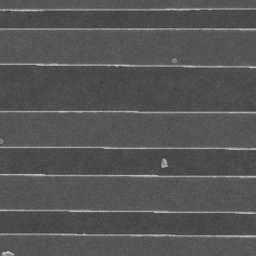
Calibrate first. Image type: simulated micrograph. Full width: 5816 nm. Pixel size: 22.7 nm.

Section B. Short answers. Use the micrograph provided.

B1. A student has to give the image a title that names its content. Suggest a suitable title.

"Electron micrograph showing lines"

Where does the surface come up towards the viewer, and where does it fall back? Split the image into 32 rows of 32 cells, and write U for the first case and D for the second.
UUUUUUUUUUUUUUUUUUUUUUUUUUUUUUUU
DDDDDDDDDDDDDDDDDDDDDDDDDDDDDDDD
DDDDDDDDDDDDDDDDDDDDDDDDDDDDDDDD
DDDDDDDDDDDDDDDDDDDDDDDDDDDDDDDD
UUUUUUUUUUUUUUUUUUUUUUUUUUUUUUUU
UUUUUUUUUUUUUUUUUUUUUUUUUUUUUUUU
UUUUUUUUUUUUUUUUUUUUUUUUUUUUUUUU
UUUUUUUUUUUUUUUUUUUUUUUUUUUUUUUU
DDDDDDDDDDDDDDDDDDDDDDDDDDDDDDDD
DDDDDDDDDDDDDDDDDDDDDDDDDDDDDDDD
DDDDDDDDDDDDDDDDDDDDDDDDDDDDDDDD
DDDDDDDDDDDDDDDDDDDDDDDDDDDDDDDD
DDDDDDDDDDDDDDDDDDDDDDDDDDDDDDDD
DDDDDDDDDDDDDDDDDDDDDDDDDDDDDDDD
UUUUUUUUUUUUUUUUUUUUUUUUUUUUUUUU
UUUUUUUUUUUUUUUUUUUUUUUUUUUUUUUU
UUUUUUUUUUUUUUUUUUUUUUUUUUUUUUUU
UUUUUUUUUUUUUUUUUUUUUUUUUUUUUUUU
DDDDDDDDDDDDDUUUUUUUUUUUUUUUUUUU
DDDDDDDDDDDDDDDDDDDDDDDDDDDDDDDD
DDDDDDDDDDDDDDDDDDDDDDDDDDDDDDDD
DDDDDDDDDDDDDDDDDDDDDDDDDDDDDDDD
UUUUUUUUUUUUUUUUUUUUUUUUUUUUUUUU
UUUUUUUUUUUUUUUUUUUUUUUUUUUUUUUU
UUUUUUUUUUUUUUUUUUUUUUUUUUUUUUUU
UUUUUUUUUUUUUUUUUUUUUUUUUUUUUUUU
DDDDDDDDDDDDDDDDDDDUUUUUUUUUUUUU
DDDDDDDDDDDDDDDDDDDDDDDDDDDDDDDD
DDDDDDDDDDDDDDDDDDDDDDDDDDDDDDDD
UUUUUUUUUUUUUUUUUUUUUUDDDDDDDDDD
UUUUUUUUUUUUUUUUUUUUUUUUUUUUUUUU
UUUUUUUUUUUUUUUUUUUUUUUUUUUUUUUU